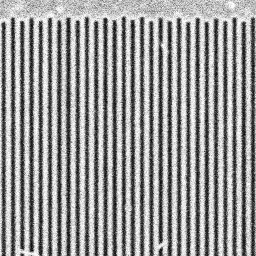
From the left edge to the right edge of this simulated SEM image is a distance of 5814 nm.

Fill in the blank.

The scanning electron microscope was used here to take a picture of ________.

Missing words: parallel lines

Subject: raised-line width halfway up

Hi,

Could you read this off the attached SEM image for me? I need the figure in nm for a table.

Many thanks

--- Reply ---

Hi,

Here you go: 102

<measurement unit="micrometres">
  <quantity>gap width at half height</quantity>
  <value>0.102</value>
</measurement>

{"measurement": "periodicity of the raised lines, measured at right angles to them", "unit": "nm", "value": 210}